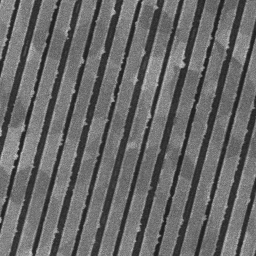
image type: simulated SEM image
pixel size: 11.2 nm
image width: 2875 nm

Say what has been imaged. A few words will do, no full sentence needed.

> parallel lines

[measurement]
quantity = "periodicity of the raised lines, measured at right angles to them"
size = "0.222 microns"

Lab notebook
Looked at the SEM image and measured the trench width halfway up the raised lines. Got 0.0624 µm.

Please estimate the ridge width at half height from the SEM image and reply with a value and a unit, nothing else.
0.156 um